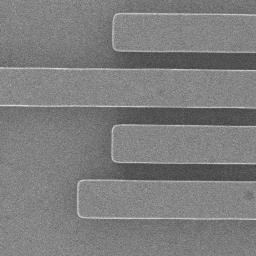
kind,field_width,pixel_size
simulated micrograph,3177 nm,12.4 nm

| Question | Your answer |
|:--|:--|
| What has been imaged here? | groups of lines, slits or small figures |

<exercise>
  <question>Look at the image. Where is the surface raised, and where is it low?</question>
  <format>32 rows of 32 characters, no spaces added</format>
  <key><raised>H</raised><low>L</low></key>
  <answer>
LLLLLLLLLLLLLLLLLLLLLLLLLLLLLLLL
LLLLLLLLLLLLLLLLLLLLLLLLLLLLLLLL
LLLLLLLLLLLLLLHHHHHHHHHHHHHHHHHH
LLLLLLLLLLLLLLHHHHHHHHHHHHHHHHHH
LLLLLLLLLLLLLLHHHHHHHHHHHHHHHHHH
LLLLLLLLLLLLLLHHHHHHHHHHHHHHHHHH
LLLLLLLLLLLLLLLLLLLLLLLLLLLHHHHH
LLLLLLLLLLLLLLLLLLLLLLLLLLLLLLLL
HLLLLLLLLLLLLLLLLLLLLLLLLLLLLLLL
HHHHHHHHHHHHHHHHHHHHHHHHHHHHHHHH
HHHHHHHHHHHHHHHHHHHHHHHHHHHHHHHH
HHHHHHHHHHHHHHHHHHHHHHHHHHHHHHHH
HHHHHHHHHHHHHHHHHHHHHHHHHHHHHHHH
LLLLLLLLLLLLLLLLLLLLLLLLLLLLLLLL
LLLLLLLLLLLLLLLLLLLLLLLLLLLLLLLL
LLLLLLLLLLLLLLLLLLLLLLLLLLLLLLLL
LLLLLLLLLLLLLLHHHHHHHHHHHHHHHHHH
LLLLLLLLLLLLLLHHHHHHHHHHHHHHHHHH
LLLLLLLLLLLLLLHHHHHHHHHHHHHHHHHH
LLLLLLLLLLLLLLHHHHHHHHHHHHHHHHHH
LLLLLLLLLLLLLLLLLLLLLLLLLLLLLLLL
LLLLLLLLLLLLLLLLLLLLLLLLLLLLLLLL
LLLLLLLLLLHHHHHLLLLLLLLLLLLLLLLL
LLLLLLLLLLHHHHHHHHHHHHHHHHHHHHHH
LLLLLLLLLLHHHHHHHHHHHHHHHHHHHHHH
LLLLLLLLLLHHHHHHHHHHHHHHHHHHHHHH
LLLLLLLLLLHHHHHHHHHHHHHHHHHHHHHH
LLLLLLLLLLLLLLLLLLLLLLLLLLLLLLLL
LLLLLLLLLLLLLLLLLLLLLLLLLLLLLLLL
LLLLLLLLLLLLLLLLLLLLLLLLLLLLLLLL
LLLLLLLLLLLLLLLLLLLLLLLLLLLLLLLL
LLLLLLLLLLLLLLLLLLLLLLLLLLLLLLLL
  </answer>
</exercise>